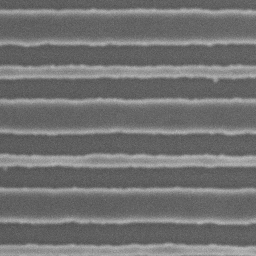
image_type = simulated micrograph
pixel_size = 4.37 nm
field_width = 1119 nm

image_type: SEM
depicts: lines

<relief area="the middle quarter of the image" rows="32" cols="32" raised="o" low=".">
.oo.o...........................
oooooooooooooooooooooooooooooooo
oooooooooooooooooooooooooooooooo
.oo.............................
................................
................................
................................
................................
................................
oooooooooooooooooooooooooooooooo
oooooooooooooooooooooooooooooooo
oooooooooooooooooooooooooooooooo
oooooooooooooooooooooooooooooooo
oooooooooooooooooooooooooooooooo
oooooooooooooooooooooooooooooooo
oooooooooooooooooooooooooooooooo
oooooooooooooooooooooooooooooooo
................................
................................
................................
................................
................................
................................
oooooooooooooooooooooooooooooooo
oooooooooooooooooooooooooooooooo
..oo.ooooooooooo.oooooooo.oooo..
................................
................................
................................
................................
................................
ooooooooooo.oooooooooooooooooooo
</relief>